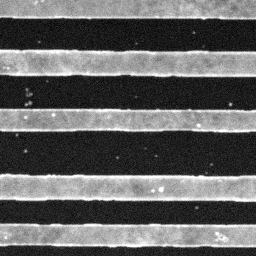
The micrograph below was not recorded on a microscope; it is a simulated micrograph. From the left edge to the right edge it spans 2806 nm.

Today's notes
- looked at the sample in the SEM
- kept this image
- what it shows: lines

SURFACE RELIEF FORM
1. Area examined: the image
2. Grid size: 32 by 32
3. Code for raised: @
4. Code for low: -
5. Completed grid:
@@@@@@@@@@@@@@@@@@@@@@@@@@@@@@@@
@@@@@@@@@@@@@@@@@@@@@@@@@@@@@@@@
--------------------------------
--------------------------------
--------------------------------
--------------------------------
@@@@@@@@@@@@----@-------@@------
@@@@@@@@@@@@@@@@@@@@@@@@@@@@@@@@
@@@@@@@@@@@@@@@@@@@@@@@@@@@@@@@@
-----------------------@@@@@@@@@
--------------------------------
--------------------------------
--------------------------------
--------------------------------
@@@@@@@@@@@@@@@@@@@@@@@@@@@@@@@@
@@@@@@@@@@@@@@@@@@@@@@@@@@@@@@@@
--------------------------------
--------------------------------
--------------------------------
--------------------------------
--------------------------------
--------------------------------
@@@@@@@@@@@@@@@@@@@@@@@@@@@@@@@@
@@@@@@@@@@@@@@@@@@@@@@@@@@@@@@@@
@@@@@@@@@@@@@@@@@@@@@@@@@@@@@@@@
--------------------------------
--------------------------------
--------------------------------
@@@@@@@@@@@@@@@@@@@@@@@@@@@@@@@@
@@@@@@@@@@@@@@@@@@@@@@@@@@@@@@@@
@@@@@@@@@@@@@@@@@@@@@@@@@@@@@@@@
--------------------------------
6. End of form